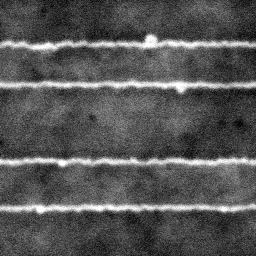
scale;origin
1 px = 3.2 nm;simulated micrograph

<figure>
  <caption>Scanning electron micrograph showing lines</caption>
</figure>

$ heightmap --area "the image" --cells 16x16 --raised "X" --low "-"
----------------
----------------
----------------
XXXXXXXXXXXXXXXX
XXXXXXXXXXXXXXXX
----------------
----------------
----------------
----------------
----------------
XXXXXXXXXXXXXXXX
XXXXXXXXXXXXXXXX
XXXXXXXXXXXXXXXX
----------------
----------------
----------------